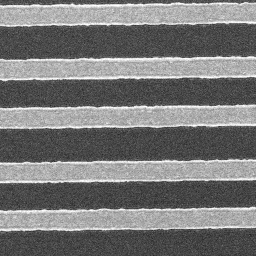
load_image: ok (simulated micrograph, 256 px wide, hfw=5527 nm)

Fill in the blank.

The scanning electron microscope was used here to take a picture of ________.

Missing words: lines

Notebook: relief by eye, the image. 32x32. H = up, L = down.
LLLLLLLLLLLLLLLLLLLLLLHLLLHHHHHH
HHHHHHHHHHHHHHHHHHHHHHHHHHHHHHHH
HHHHHHHHHHHHHHHHHHHHHHHHHHHHHHHH
LLLLLLLLLLLLLLLLLLLLLLLLLLLLLLLL
LLLLLLLLLLLLLLLLLLLLLLLLLLLLLLLL
LLLLLLLLLLLLLLLLLLLLLLLLLLLLLLLL
LLLLLLLLLLLLLLLLLLLLLLLLLLLLLLLL
LLLLLHHHLHHHHHHHHHHHHHHHHHHHHHHH
HHHHHHHHHHHHHHHHHHHHHHHHHHHHHHHH
HHHHHHHHHHHHHHHHHHHHHHHHHHHHHHHL
LLLLLLLLLLLLLLLLLLLLLLLLLLLLLLLL
LLLLLLLLLLLLLLLLLLLLLLLLLLLLLLLL
LLLLLLLLLLLLLLLLLLLLLLLLLLLLLLLL
LLLLLLLLLLHHLLLHHHHHHHHHHHHHHHHH
HHHHHHHHHHHHHHHHHHHHHHHHHHHHHHHH
HHHHHHHHHHHHHHHHHHHHHHHHHHHHHHHH
LLLLLLLLLLLLLLLLLLLLLLLLLLLLLLLL
LLLLLLLLLLLLLLLLLLLLLLLLLLLLLLLL
LLLLLLLLLLLLLLLLLLLLLLLLLLLLLLLL
LLLLLLLLLLLLLLLLLLLLLLLLLLLLLLLL
HHHHHHHHHHHHHHHHHHHHHHHHHHHHHHHH
HHHHHHHHHHHHHHHHHHHHHHHHHHHHHHHH
HHHHHHHHHHHHHHHHHHHHHHHLLLLLLLLL
LLLLLLLLLLLLLLLLLLLLLLLLLLLLLLLL
LLLLLLLLLLLLLLLLLLLLLLLLLLLLLLLL
LLLLLLLLLLLLLLLLLLLLLLLLLLLLLLLL
HHHHHHHHHHHHHHHHHHHHHHHHHHHHHHHH
HHHHHHHHHHHHHHHHHHHHHHHHHHHHHHHH
HHHHHHHHHHHHHHHHHHHHHHHHHHLLLLLL
LLLLLLLLLLLLLLLLLLLLLLLLLLLLLLLL
LLLLLLLLLLLLLLLLLLLLLLLLLLLLLLLL
LLLLLLLLLLLLLLLLLLLLLLLLLLLLLLLL